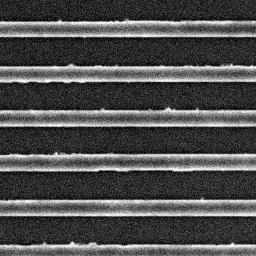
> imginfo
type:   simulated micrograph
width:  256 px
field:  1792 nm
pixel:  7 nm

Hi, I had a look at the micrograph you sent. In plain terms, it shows lines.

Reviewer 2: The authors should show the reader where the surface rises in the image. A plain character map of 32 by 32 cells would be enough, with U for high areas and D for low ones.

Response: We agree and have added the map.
DDDDDDDDDDDDDDDDDDDDDDDDDDDDDDDD
DDDDDDDDDDDDDDDDDDDDDDDDDDDDDDDD
DDDDDDDDDDDDDDDDDDDDDDDDDDDDDDDD
UUUUUUUUUUUUUUUUUUUUUUUUUUUUUUUU
UUUUUUUUUUUUUUUUUUUUUUUUUUUUUUUU
DDDDDDDDDDDDDDDDDDDDDDDDDDDDDDDD
DDDDDDDDDDDDDDDDDDDDDDDDDDDDDDDD
DDDDDDDDDDDDDDDDDDDDDDDDDDDDDDDD
UUUUUUUUUUUUUUUUUUUUUUUUUUUUUUUU
UUUUUUUUUUUUUUUUUUUUUUUUUUUUUUUU
DDDDDDDDDDDDDDDDDDDDDDDDDDDDDDDD
DDDDDDDDDDDDDDDDDDDDDDDDDDDDDDDD
DDDDDDDDDDDDDDDDDDDDDDDDDDDDDDDD
DDDDDDDDDDDDDDDDDDDDDDDDDDDDDDDD
UUUUUUUUUUUUUUUUUUUUUUUUUUUUUUUU
UUUUUUUUUUUUUUUUUUUUUUUUUUUUUUUU
DDDDDDDDDDDDDDDDDDDDDDDDDDDDDDDD
DDDDDDDDDDDDDDDDDDDDDDDDDDDDDDDD
DDDDDDDDDDDDDDDDDDDDDDDDDDDDDDDD
UUUUUUUUUUUUUUUUUUUUUUUUUUUUUUUU
UUUUUUUUUUUUUUUUUUUUUUUUUUUUUUUU
DDDDDDDDDDDDDDDDDDDDDDDDDDDDDDDD
DDDDDDDDDDDDDDDDDDDDDDDDDDDDDDDD
DDDDDDDDDDDDDDDDDDDDDDDDDDDDDDDD
DDDDDDDDDDDDDDDDDDDDDDDDDDDDDDDD
UUUUUUUUUUUUUUUUUUUUUUUUUUUUUUUU
UUUUUUUUUUUUUUUUUUUUUUUUUUUUUUUU
DDDDDDDDDDDDDDDDDDDDDDDDDDDDDDDD
DDDDDDDDDDDDDDDDDDDDDDDDDDDDDDDD
DDDDDDDDDDDDDDDDDDDDDDDDDDDDDDDD
DDDDDDDDDDDDDDDDDDDDDDDDDDDDDDDD
UUUUUUUUUUUUUUUUUUUUUUUUUUUUUUUU